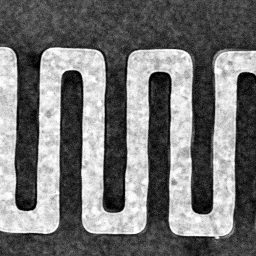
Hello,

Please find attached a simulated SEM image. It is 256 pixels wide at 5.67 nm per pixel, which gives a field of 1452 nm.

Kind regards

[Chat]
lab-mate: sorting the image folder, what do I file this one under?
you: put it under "groups of lines, slits or small figures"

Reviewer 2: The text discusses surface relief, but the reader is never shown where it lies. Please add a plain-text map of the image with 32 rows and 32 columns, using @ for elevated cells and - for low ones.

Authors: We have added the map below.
--------------------------------
--------------------------------
--------------------------------
--------------------------------
--------------------------------
--------------------------------
@@----@@@@@@-----@@@@@@-----@@@@
@@---@@@@@@@@---@@@@@@@@---@@@@@
@@---@@@@@@@@---@@@@@@@@---@@@@@
@@---@@@--@@@---@@@--@@@---@@@--
@@---@@@---@@---@@@---@@---@@---
@@---@@----@@---@@---@@@---@@---
@@---@@----@@---@@---@@@---@@---
@@---@@----@@---@@@--@@@---@@---
@@---@@---@@@---@@@--@@@---@@---
@@---@@---@@@---@@---@@@---@@---
@@---@@---@@@---@@---@@@---@@---
@@---@@----@@---@@---@@@---@@---
@@---@@---@@@---@@---@@@---@@---
@@---@@---@@@---@@---@@@---@@---
@@---@@---@@@---@@---@@@---@@---
@@---@@---@@@---@@---@@@---@@---
@@---@@---@@@---@@---@@@---@@---
@@---@@---@@@---@@---@@@---@@---
@@---@@---@@@---@@---@@@---@@---
@@---@@---@@@---@@---@@@---@@---
@@@@@@@---@@@--@@@---@@@--@@@---
@@@@@@@---@@@@@@@@---@@@@@@@@---
@@@@@@@----@@@@@@@---@@@@@@@@---
--------------------------------
--------------------------------
--------------------------------